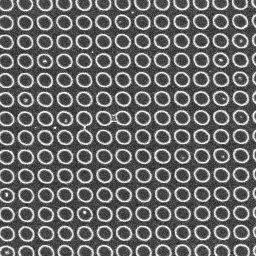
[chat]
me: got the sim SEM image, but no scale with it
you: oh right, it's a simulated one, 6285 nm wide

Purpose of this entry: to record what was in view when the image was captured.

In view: a regular array of raised bodies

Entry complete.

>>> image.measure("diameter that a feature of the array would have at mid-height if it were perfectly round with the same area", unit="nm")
346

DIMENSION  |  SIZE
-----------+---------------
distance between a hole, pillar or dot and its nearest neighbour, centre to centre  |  468 nanometres